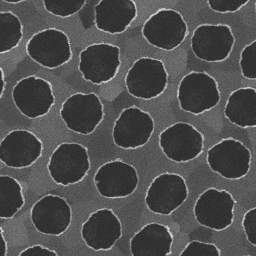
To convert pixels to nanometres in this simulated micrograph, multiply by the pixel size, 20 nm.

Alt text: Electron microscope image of a regular array of holes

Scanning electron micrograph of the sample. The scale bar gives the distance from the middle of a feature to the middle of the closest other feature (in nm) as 1020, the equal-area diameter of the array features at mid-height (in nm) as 796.